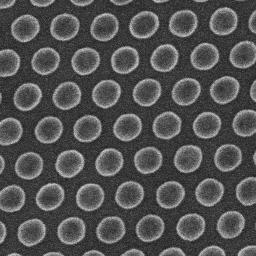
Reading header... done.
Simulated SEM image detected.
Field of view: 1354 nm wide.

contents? a regular array of raised bodies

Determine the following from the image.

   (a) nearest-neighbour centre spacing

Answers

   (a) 204 nm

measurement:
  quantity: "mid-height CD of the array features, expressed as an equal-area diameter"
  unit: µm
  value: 0.143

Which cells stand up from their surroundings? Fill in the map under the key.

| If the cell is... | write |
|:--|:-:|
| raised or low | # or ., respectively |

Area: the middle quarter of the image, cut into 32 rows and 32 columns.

..######....######....######....
...#####.....####......###......
................................
................................
.........####......####......###
###.....######....######....####
####...#######...#######...#####
####...#######...#######...#####
####...#######...######....#####
####....#####.....#####.....####
##.......###....................
................................
.........................##.....
.....###......#####....######...
...######....######....######...
...######....######...#######...
...######...#######...#######...
...######....#####.....#####....
...#####......###........##.....
................................
..............................##
..........###.......###......###
####.....#####....######....####
#####....######...######....####
#####...#######...######....####
#####...######....######....####
####....######.....####......###
###.......###...................
................................
................................
.....####.....#####.....#####...
....#####....#######....######..